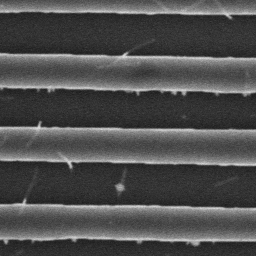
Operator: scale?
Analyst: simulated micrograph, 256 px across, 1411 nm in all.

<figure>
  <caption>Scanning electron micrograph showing lines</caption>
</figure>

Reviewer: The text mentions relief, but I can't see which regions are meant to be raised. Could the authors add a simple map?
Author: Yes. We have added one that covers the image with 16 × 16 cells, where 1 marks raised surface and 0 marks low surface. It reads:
1111111111111111
0000000000000000
0000000000000000
1111111100000000
1111111111111111
0000111111111111
0000000000000000
0000000000000000
1111111111111111
1111111111111111
0000000000000000
0000000000000000
0000000000000000
1111111111111111
1111111111111111
0000000000000000